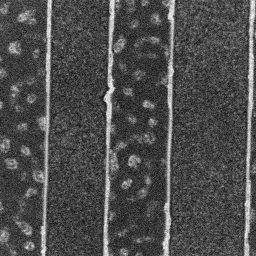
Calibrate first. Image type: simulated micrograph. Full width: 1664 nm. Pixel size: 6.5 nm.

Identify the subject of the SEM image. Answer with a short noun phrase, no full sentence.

one or a few lines or trenches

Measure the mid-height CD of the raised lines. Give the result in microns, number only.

0.41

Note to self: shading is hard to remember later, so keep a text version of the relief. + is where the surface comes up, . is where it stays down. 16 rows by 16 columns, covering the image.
+++....++++.....
+++....++++.....
+++....++++.....
+++....++++.....
+++....++++.....
+++....++++.....
+++....++++.....
+++....++++.....
+++....++++.....
+++....++++....+
+++....++++....+
+++....++++....+
+++....++++....+
+++....++++....+
+++....++++....+
+++....++++....+